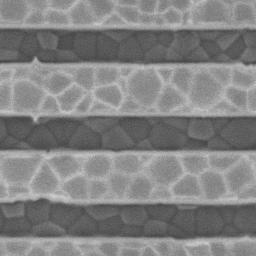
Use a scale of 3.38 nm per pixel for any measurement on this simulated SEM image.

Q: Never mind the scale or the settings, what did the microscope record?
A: one or a few lines or trenches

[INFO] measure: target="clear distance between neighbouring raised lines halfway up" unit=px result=36.9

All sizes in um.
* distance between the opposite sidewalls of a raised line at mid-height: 0.17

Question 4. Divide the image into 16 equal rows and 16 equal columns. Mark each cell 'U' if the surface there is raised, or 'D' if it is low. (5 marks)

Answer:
UUUUUUUUUUUUUUUU
UUUUUUUUUUUUUUUU
DDDDDDDDDDDDDDDD
DDDDDDDDDDDDDDDD
UUUUUUUUUUUUUUUU
UUUUUUUUUUUUUUUU
UUUUUUUUUUUUUUUU
DDDDDDDDDDDDDDDD
DDDDDDDDDDDDDDDD
DDDDDDDDDDDDDDDD
UUUUUUUUUUUUUUUU
UUUUUUUUUUUUUUUU
UDDDUUUUUUUUUUUU
DDDDDDDDDDDDDDDD
DDDDDDDDDDDDDDDD
UUUUUUUUUUUUUUUU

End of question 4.